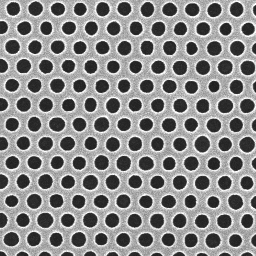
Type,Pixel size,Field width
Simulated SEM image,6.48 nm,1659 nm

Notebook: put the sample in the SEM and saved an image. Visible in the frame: a regular array of holes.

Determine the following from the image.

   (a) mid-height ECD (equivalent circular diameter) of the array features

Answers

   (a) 89.3 nm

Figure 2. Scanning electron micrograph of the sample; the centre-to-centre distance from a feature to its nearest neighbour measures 0.141 microns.